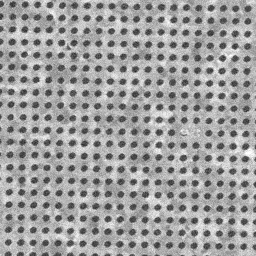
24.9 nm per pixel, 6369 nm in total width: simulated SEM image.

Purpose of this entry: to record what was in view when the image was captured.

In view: a regular array of holes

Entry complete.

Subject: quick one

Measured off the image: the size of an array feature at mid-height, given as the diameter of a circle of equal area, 0.188 um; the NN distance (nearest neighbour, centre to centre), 305 nanometers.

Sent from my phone